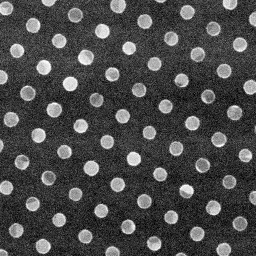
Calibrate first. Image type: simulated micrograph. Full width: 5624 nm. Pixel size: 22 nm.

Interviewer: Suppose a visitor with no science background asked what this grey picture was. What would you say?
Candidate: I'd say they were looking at a regular array of raised bodies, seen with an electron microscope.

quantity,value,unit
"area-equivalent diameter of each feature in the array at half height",0.285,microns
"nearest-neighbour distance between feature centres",30.3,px